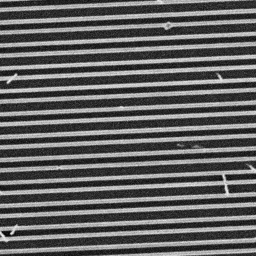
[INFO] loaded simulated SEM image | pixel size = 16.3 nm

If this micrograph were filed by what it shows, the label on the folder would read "parallel lines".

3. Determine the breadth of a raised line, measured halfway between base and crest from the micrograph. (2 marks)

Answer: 0.0467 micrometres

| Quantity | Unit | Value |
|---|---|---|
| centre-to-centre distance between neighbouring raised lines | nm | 187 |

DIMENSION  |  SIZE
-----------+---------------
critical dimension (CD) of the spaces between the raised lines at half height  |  154 nanometres